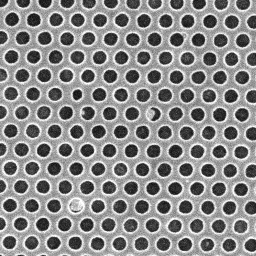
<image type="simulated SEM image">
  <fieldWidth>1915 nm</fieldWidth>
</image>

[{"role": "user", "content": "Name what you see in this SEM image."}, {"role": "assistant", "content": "a regular array of holes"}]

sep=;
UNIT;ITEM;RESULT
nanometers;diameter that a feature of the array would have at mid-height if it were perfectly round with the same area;107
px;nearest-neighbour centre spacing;21.3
